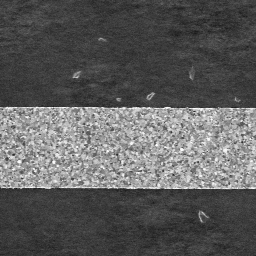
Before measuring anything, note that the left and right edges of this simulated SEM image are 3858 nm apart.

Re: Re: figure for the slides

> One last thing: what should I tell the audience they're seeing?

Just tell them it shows one or a few lines or trenches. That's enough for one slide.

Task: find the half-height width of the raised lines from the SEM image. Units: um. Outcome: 1.22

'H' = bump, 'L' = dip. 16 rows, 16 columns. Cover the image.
LLLLLLLLLLLLLLLL
LLLLLLLLLLLLLLLL
LLLLLLLLLLLLLLLL
LLLLLLLLLLLLLLLL
LLLLLLLLLLLLLLLL
LLLLLLLLLLLLLLLL
LLLLLLLLLLLLLLLL
HHHHHHHHHHHHHHHH
HHHHHHHHHHHHHHHH
HHHHHHHHHHHHHHHH
HHHHHHHHHHHHHHHH
HHHHHHHHHHHHHHHH
LLLLLLLLLLLLLLLL
LLLLLLLLLLLLLLLL
LLLLLLLLLLLLLLLL
LLLLLLLLLLLLLLLL